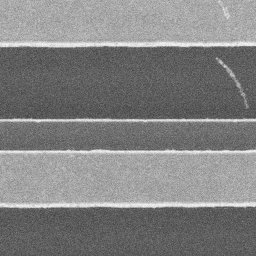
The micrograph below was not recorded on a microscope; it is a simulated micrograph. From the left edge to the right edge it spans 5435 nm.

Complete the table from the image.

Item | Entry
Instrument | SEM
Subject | lines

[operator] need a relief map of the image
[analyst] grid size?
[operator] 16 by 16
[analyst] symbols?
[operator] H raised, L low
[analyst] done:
HHHHHHHHHHHHHHHH
HHHHHHHHHHHHHHHH
HHHHHHHHHHHHHHHH
LLLLLLLLLLLLLLLL
LLLLLLLLLLLLLLLL
LLLLLLLLLLLLLLLL
LLLLLLLLLLLLLLLL
LLLLLLLLLLLLLLLL
HHHHHHHHHHHHHHHH
HHHHHHHHHHHHHHHH
HHHHHHHHHHHHHHHH
HHHHHHHHHHHHHHHH
HHHHHHHHHHHHHHHH
LLLLLLLLLLLLLLLL
LLLLLLLLLLLLLLLL
LLLLLLLLLLLLLLLL